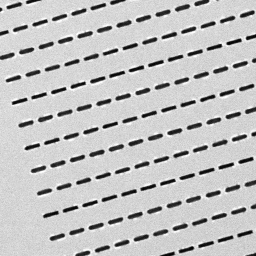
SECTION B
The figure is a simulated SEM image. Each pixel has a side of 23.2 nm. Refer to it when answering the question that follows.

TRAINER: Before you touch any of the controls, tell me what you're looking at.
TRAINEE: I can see a regular array of holes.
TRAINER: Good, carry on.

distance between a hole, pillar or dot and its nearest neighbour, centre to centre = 466 nanometres